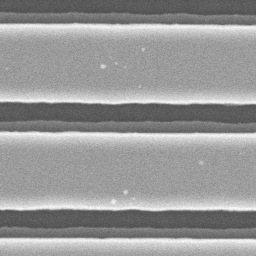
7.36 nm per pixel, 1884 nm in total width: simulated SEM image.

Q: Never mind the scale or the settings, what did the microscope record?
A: lines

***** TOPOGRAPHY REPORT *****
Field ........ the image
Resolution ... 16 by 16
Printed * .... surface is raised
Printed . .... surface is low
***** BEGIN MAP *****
................
................
****************
****************
****************
****************
................
................
****************
****************
****************
****************
****************
................
................
****************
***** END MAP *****